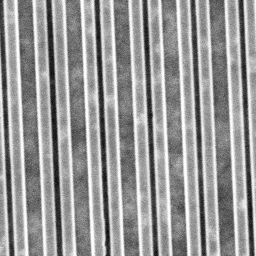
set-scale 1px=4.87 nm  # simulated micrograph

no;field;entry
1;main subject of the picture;parallel lines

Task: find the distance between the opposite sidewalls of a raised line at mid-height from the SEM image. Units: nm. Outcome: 59.6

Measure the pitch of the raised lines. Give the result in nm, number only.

120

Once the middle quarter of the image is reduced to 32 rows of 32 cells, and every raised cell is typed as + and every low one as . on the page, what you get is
+....+++..+++....+++..+++....+++
+....+++..+++....+++..+++....+++
+....+++..+++....+++..+++....+++
+....+++..+++....+++..+++....+++
+....+++..+++....+++..+++....+++
+....+++..+++....+++..+++....+++
+....+++..+++....+++..+++.....++
+.....++..+++....+++..+++.....++
+.....++..+++....+++..+++.....++
+.....++..+++.....++..+++.....++
+.....++..+++.....++..+++.....++
+.....+++.+++.....++..+++.....++
+.....+++.+++.....++..+++.....++
+.....+++.+++.....+++.+++.....++
+.....+++.+++.....+++.+++.....++
+.....+++..++.....+++.+++.....++
+.....+++..++.....+++.+++.....++
++....+++..++.....+++..++.....++
++....+++..++.....+++..++.....++
++....+++..+++....+++..++.....++
++....+++..+++....+++..++.....++
++....+++..+++....+++..+++....++
++....+++..+++....+++..+++....++
++....+++..+++....+++..+++....++
++....+++..+++....+++..+++....++
++....+++..+++....+++..+++....++
++....+++..+++....+++..+++....++
++....+++..+++....+++..+++....++
++....+++..+++....+++..+++....++
++....+++..+++....+++..+++....++
++.....++..+++....+++..+++....++
++.....++..+++....+++..+++....++